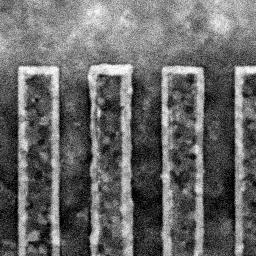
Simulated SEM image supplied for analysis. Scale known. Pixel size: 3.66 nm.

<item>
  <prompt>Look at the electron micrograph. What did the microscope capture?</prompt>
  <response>one or a few lines or trenches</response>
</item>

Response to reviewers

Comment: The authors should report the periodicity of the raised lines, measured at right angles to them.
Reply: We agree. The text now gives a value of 0.264 µm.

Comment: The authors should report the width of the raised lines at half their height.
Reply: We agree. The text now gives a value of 125 nanometres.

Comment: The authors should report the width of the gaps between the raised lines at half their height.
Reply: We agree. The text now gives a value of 0.141 micrometres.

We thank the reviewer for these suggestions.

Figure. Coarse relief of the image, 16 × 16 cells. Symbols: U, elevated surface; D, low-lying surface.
DDDDDDDDDDDDDDDD
DDDDDDDDDDDDDDDD
DDDDDDDDDDDDDDDD
DDDDDDDDDDDDDDDD
DDUDDDUUDDDUDDDU
DUUDDDUUDDUUDDDU
DUUDDDUUDDUUDDDU
DUUDDDUUDDUUUDDU
DUUDDDUUDDUUUDDU
DUUDDDUUDDUUUDDU
DUUDDDUUDDUUUDDU
DUUDDDUUDDUUDDDU
DUUDDDUUDDUUDDDU
DUUDDDUUDDUUDDDU
DUUDDDUUDDUUDDDU
DUUDDDUUDDUUDDDU